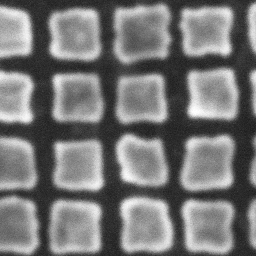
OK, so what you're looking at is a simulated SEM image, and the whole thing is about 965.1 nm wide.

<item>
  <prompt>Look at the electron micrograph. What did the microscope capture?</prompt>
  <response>a regular array of raised bodies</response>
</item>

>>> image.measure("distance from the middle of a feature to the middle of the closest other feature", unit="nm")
236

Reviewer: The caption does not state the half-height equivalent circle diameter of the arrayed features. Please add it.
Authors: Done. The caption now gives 0.2 microns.